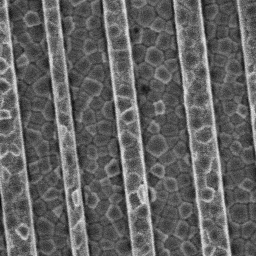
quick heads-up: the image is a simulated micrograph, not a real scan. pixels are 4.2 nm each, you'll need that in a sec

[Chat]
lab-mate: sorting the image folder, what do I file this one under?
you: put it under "one or a few lines or trenches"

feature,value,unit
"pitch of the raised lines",280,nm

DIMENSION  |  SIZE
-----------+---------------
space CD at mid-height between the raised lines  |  185 nm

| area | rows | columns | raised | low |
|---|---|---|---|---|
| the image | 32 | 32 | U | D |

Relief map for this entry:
UDDDDUUDDDDDDUUUDDDDDDUUUDDDDDUU
UDDDDDUDDDDDDUUUDDDDDDUUUDDDDDUU
UDDDDDUDDDDDDUUUDDDDDDUUUDDDDDUU
UDDDDDUUDDDDDUUUDDDDDDUUUDDDDDUU
UDDDDDUUDDDDDUUUDDDDDDUUUUDDDDUU
UDDDDDUUDDDDDUUUDDDDDDUUUUDDDDUU
UUDDDDUUDDDDDDUUDDDDDDUUUUDDDDUU
UUDDDDUUDDDDDDUUDDDDDDDUUUDDDDDU
UUDDDDUUDDDDDDUUUDDDDDDUUUDDDDDU
UUDDDDUUDDDDDDUUUDDDDDDUUUDDDDDU
UUDDDDDUDDDDDDUUUDDDDDDUUUDDDDDU
UUDDDDDUUDDDDDUUUDDDDDDUUUDDDDDU
UUDDDDDUUDDDDDUUUDDDDDDUUUDDDDDU
UUDDDDDUUDDDDDUUUDDDDDDUUUUDDDDU
UUUDDDDUUDDDDDDUUDDDDDDUUUUDDDDU
UUUDDDDUUDDDDDDUUDDDDDDUUUUDDDDD
UUUDDDDUUDDDDDDUUUDDDDDDUUUDDDDD
UUUDDDDUUDDDDDDUUUDDDDDDUUUDDDDD
UUUDDDDDUDDDDDDUUUDDDDDDUUUDDDDD
UUUDDDDDUUDDDDDUUUDDDDDDUUUDDDDD
UUUDDDDDUUDDDDDUUUDDDDDDUUUDDDDD
UUUDDDDDUUDDDDDUUUDDDDDDUUUUDDDD
UUUDDDDDUUDDDDDDUUDDDDDDUUUUDDDD
UUUUDDDDUUDDDDDDUUDDDDDDUUUUDDDD
UUUUDDDDUUDDDDDDUUUDDDDDDUUUDDDD
UUUUDDDDUUDDDDDDUUUDDDDDDUUUDDDD
UUUUDDDDDUDDDDDDUUUDDDDDDUUUDDDD
UUUUDDDDDUUDDDDDUUUDDDDDDUUUDDDD
DUUUDDDDDUUDDDDDUUUDDDDDDUUUDDDD
DUUUDDDDDUUDDDDDUUUDDDDDDUUUUDDD
DUUUDDDDDUUDDDDDUUUDDDDDDUUUUDDD
DUUUUDDDDUUDDDDDDUUDDDDDDUUUUDDD